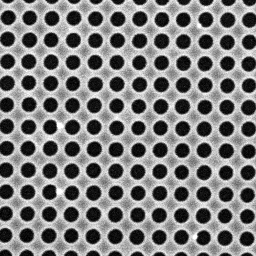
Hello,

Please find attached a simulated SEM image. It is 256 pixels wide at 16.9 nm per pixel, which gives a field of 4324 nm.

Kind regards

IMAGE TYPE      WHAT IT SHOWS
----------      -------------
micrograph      a regular array of holes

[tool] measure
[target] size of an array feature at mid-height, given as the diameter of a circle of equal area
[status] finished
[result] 269 nanometres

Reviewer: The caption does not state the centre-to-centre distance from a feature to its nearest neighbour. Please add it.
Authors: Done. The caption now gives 21.5 px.